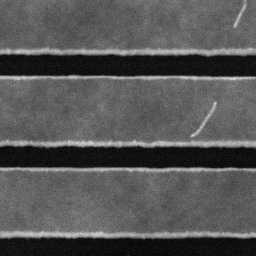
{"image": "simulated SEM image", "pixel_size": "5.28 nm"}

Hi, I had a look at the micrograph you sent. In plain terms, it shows lines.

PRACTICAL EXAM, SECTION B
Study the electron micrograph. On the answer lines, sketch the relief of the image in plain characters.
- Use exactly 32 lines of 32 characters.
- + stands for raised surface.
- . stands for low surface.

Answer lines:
++++++++++++++++++++++++++++++++
++++++++++++++++++++++++++++++++
++++++++++++++++++++++++++++++++
++++++++++++++++++++++++++++++++
++++++++++++++++++++++++++++++++
++++++++++++++++++++++++++++++++
++++++++++++++++++++++++++++++++
................................
................................
........++......................
++++++++++++++++++++++++++++++++
++++++++++++++++++++++++++++++++
++++++++++++++++++++++++++++++++
++++++++++++++++++++++++++++++++
++++++++++++++++++++++++++++++++
++++++++++++++++++++++++++++++++
++++++++++++++++++++++++++++++++
++++++++++++++++++++++++++++++++
................................
................................
................................
++++++++++++++++++++++++++++++++
++++++++++++++++++++++++++++++++
++++++++++++++++++++++++++++++++
++++++++++++++++++++++++++++++++
++++++++++++++++++++++++++++++++
++++++++++++++++++++++++++++++++
++++++++++++++++++++++++++++++++
++++++++++++++++++++++++++++++++
++++++++++++++++++++++++++++++++
................................
................................